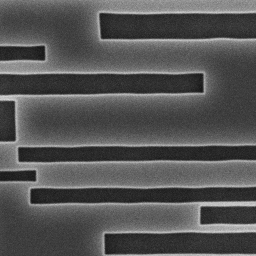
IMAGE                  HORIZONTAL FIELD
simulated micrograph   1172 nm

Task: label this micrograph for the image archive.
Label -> groups of lines, slits or small figures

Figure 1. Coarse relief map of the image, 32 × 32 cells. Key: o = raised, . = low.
oooooooooooooooooooooooooooooooo
ooooooooooooo.oooooooooo.oooooo.
oooooooooooo....................
oooooooooooo....................
ooooooooooooo...................
oooooooooooooooooooooooooooooooo
......oooooooooooooooooooooooooo
.....ooooooooooooooooooooooooooo
oooooooooooooooooooooooooooooooo
.........................ooooooo
..........................oooooo
.........................ooooooo
.ooooooooooooooooooooooooooooooo
..oooooooooooooooooooooooooooooo
..oooooooooooooooooooooooooooooo
..oooooooooooooooooooooooooooooo
..oooooooooooooooooooooooooooooo
..oooooooooooooooooooooooooooooo
ooo.............................
oo..............................
oooooooooooooooooooooooooooooooo
....oooooooooooooooooooooooooooo
....oooooooooooooooooooooooooooo
oooo............................
oooo............................
oooo....ooo.ooooooooooooo......o
ooooooooooooooooooooooooo.......
ooooooooooooooooooooooooo.......
oooooooooooooooooooooooooooooooo
ooooooooooooo...................
ooooooooooooo...................
ooooooooooooo...................